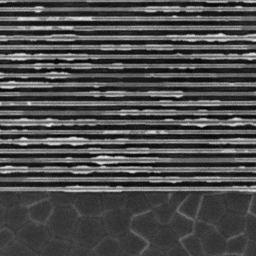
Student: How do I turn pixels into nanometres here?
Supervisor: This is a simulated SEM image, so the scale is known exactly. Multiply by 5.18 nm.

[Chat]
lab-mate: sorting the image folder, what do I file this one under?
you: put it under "parallel lines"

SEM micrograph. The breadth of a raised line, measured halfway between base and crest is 3.75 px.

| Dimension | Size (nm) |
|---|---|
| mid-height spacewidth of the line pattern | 28.5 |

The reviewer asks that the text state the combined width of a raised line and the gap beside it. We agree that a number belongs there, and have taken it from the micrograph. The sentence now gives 49.1 nm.